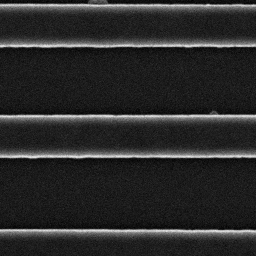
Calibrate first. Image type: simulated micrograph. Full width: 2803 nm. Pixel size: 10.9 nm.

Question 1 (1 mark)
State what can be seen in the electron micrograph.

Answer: lines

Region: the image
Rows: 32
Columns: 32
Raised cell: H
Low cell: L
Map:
LLLLLLLLLLLLLLLLLLLLLLLLLLLLLLLL
HHHHHHHHHHHHHHHHHHHHHHHHHHHHHHHH
HHHHHHHHHHHHHHHHHHHHHHHHHHHHHHHH
HHHHHHHHHHHHHHHHHHHHHHHHHHHHHHHH
HHHHHHHHHHHHHHHHHHHHHHHHHHHHHHHH
HHHHHHHHHHHHHHHHHHHHHHHHHHHHHHHH
LLLLLLLLLLLLLLLLLLLLLLLLLLLLLLLL
LLLLLLLLLLLLLLLLLLLLLLLLLLLLLLLL
LLLLLLLLLLLLLLLLLLLLLLLLLLLLLLLL
LLLLLLLLLLLLLLLLLLLLLLLLLLLLLLLL
LLLLLLLLLLLLLLLLLLLLLLLLLLLLLLLL
LLLLLLLLLLLLLLLLLLLLLLLLLLLLLLLL
LLLLLLLLLLLLLLLLLLLLLLLLLLLLLLLL
LLLLLLLLLLLLLLLLLLLLLLLLLLLLLLLL
LLLLLLLLLLLLLLLLLLLLLLLLLLLLLLLL
HHHHHHHHHHHHHHHHHHHHHHHHHHHHHHHH
HHHHHHHHHHHHHHHHHHHHHHHHHHHHHHHH
HHHHHHHHHHHHHHHHHHHHHHHHHHHHHHHH
HHHHHHHHHHHHHHHHHHHHHHHHHHHHHHHH
HHHHHHHHHHHHHHHHHHHHHHHHHHHHHHHH
LLLLLLLLLLLLLLLLLLLLLLLLLLLLLLLL
LLLLLLLLLLLLLLLLLLLLLLLLLLLLLLLL
LLLLLLLLLLLLLLLLLLLLLLLLLLLLLLLL
LLLLLLLLLLLLLLLLLLLLLLLLLLLLLLLL
LLLLLLLLLLLLLLLLLLLLLLLLLLLLLLLL
LLLLLLLLLLLLLLLLLLLLLLLLLLLLLLLL
LLLLLLLLLLLLLLLLLLLLLLLLLLLLLLLL
LLLLLLLLLLLLLLLLLLLLLLLLLLLLLLLL
LLLLLLLLLLLLLLLLLLLLLLLLLLLLLLLL
HHHHHHHHHHHHHHHHHHHHHHHHHHHHHHHH
HHHHHHHHHHHHHHHHHHHHHHHHHHHHHHHH
HHHHHHHHHHHHHHHHHHHHHHHHHHHHHHHH